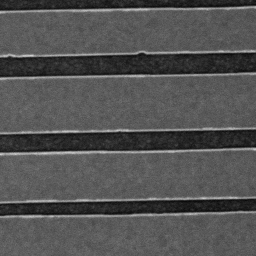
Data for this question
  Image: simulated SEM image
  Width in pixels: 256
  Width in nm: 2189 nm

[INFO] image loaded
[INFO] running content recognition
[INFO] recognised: one or a few lines or trenches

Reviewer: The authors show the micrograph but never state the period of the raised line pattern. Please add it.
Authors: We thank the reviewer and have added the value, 0.617 micrometres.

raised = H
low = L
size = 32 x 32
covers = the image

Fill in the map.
LLLLLLLLLLLLLLLLLLLLLLLLLLLLLLLL
LLHHHHHHHHHHHHHHHHHHHHHHHHHHHHHH
HHHHHHHHHHHHHHHHHHHHHHHHHHHHHHHH
HHHHHHHHHHHHHHHHHHHHHHHHHHHHHHHH
HHHHHHHHHHHHHHHHHHHHHHHHHHHHHHHH
HHHHHHHHHHHHHHHHHHHHHHHHHHHHHHHH
HHHHHHHHHHHHHHHHHLHHHLLLLLLLHHLL
LLLLLLLLLLLLLLLLLLLLLLLLLLLLLLLL
LLLLLLLLLLLLLLLLLLLLLLLLLLLLLLLL
LLLLLLLLLLLLLLLLHLLLHHHHHHHHHHHH
HHHHHHHHHHHHHHHHHHHHHHHHHHHHHHHH
HHHHHHHHHHHHHHHHHHHHHHHHHHHHHHHH
HHHHHHHHHHHHHHHHHHHHHHHHHHHHHHHH
HHHHHHHHHHHHHHHHHHHHHHHHHHHHHHHH
HHHHHHHHHHHHHHHHHHHHHHHHHHHHHHHH
HHHHHHHHHHHHHHHHHHHHHHHHHHHHHHHH
HHHHHHHHLLLLLLLLLLLLLLLLLLLLLLLL
LLLLLLLLLLLLLLLLLLLLLLLLLLLLLLLL
LLLLLLLLLLLLLLLLLLLLLLLLLLLLLLLL
HHHHHHHHHHHHHHHHHHHHHHHHHHHHHHHH
HHHHHHHHHHHHHHHHHHHHHHHHHHHHHHHH
HHHHHHHHHHHHHHHHHHHHHHHHHHHHHHHH
HHHHHHHHHHHHHHHHHHHHHHHHHHHHHHHH
HHHHHHHHHHHHHHHHHHHHHHHHHHHHHHHH
HHHHHHHHHHHHHHHHHHHHHHHHHHHHHHHH
LLLLLLLLLLLLLLLLLLLLLLLLLLLLLLLL
LLLLLLLLLLLLLLLLLLLLLLLLLLLLLLLL
HHHHHHHHHHHHHHHHHHHHHHHHHHHHHHHH
HHHHHHHHHHHHHHHHHHHHHHHHHHHHHHHH
HHHHHHHHHHHHHHHHHHHHHHHHHHHHHHHH
HHHHHHHHHHHHHHHHHHHHHHHHHHHHHHHH
HHHHHHHHHHHHHHHHHHHHHHHHHHHHHHHH